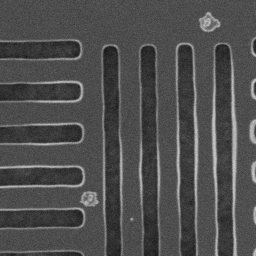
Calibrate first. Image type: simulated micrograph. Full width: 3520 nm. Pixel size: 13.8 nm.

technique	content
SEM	groups of lines, slits or small figures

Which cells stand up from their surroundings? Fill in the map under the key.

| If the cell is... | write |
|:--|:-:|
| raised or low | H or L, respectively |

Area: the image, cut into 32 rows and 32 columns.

HHHHHHHHHHHHHHHHHHHHHHHHHHHHHHHH
HHHHHHHHHHHHHHHHHHHHHHHHHHHHHHHH
HHHHHHHHHHHHHHHHHHHHHHHHHHHHHHHH
HHHHHHHHHHHHHHHHHHHHHHHHHHHHHHHH
HHHHHHHHHHHHHHHHHHHHHHHHHHHHHHHH
LLLLLLLLLLHHHHHHHHHHHHHHHHHHHHHH
LLLLLLLLLLHHHLLHHHLHHHLLHHHLLHHH
HHHHLHHHHHHHHLLHHLLLHHLLHHHLLHHH
HHHHHHHHHHHHHLLHHLLLHHLLHHHLLHHH
HHHHHHHHHHHHHLLHHLLLHHLLHHHLLHHH
LLLLLLLLLLHHHLLHHHLLHHLLHHHLLHHH
LLLLLLLLLLHHHLLHHHLLHHLLHHHLLHHH
LLLLLLLLLLHHHLLHHHLLHHLLHHHLLHHH
HHHHHHHHHHHHHLLHHHLLHHLLHHHLLHHH
HHHHHHHHHHHHHLLHHHLLHHLLHHHLLHHH
HHHHHHHHLHHHHLLHHHLLHHLLHHHLLHHH
LLLLLLLLLLHHHLLHHHLLHHLLLHHLLHHL
LLLLLLLLLLHHHLLHHHLLHHLLLHHLLHHH
HHHHHHHHHHHHHLLHHHLLHHLLLHHLLHHH
HHHHHHHHHHHHHLLHHHLLHHLLLHHLLHHH
HHHHHHHHHHHHHLLHHHLLHHLLLHHLLHHH
LLLLLLLLLLHHHLLHHLLLHHLLLHHLLHHH
LLLLLLLLLLHHHLLHHHLLHHLLLHHLLHHH
HHHHHHHHHHHHHLLHHHLLHHLLLHHLLHHH
HHHHHHHHHHHHHLLHHHLLHHLLLHHLLHHH
HHHHHHHHHHHHHLLHHHLLHHLLLHHLLHHH
LLLLLLLLLLHHHLLHHHLLHHLLLHHLLHHH
LLLLLLLLLLHHHLLHHHLLHHLLLHHLLHHH
LLLLHHHHHHHHHLLHHHLLHHLLLHHLLHHH
HHHHHHHHHHHHHLLHHHLLHHLLLHHLLHHH
HHHHHHHHHHHHHLLHHHLLHHLLLHHLLHHH
LLHLLLLLLLHHHLLHHHLLHHHLLHHLLHHH